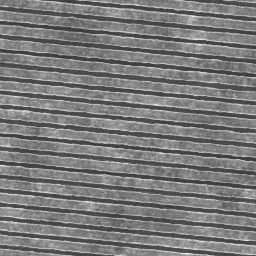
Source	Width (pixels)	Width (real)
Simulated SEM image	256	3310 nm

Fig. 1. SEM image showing parallel lines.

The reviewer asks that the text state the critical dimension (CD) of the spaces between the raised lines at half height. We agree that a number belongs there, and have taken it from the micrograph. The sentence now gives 0.0499 microns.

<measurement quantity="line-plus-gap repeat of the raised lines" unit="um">0.18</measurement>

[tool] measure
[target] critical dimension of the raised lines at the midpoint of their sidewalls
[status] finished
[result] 0.124 µm